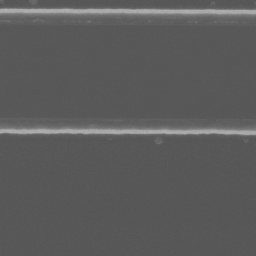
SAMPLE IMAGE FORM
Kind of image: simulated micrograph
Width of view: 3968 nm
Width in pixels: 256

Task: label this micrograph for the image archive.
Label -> one or a few lines or trenches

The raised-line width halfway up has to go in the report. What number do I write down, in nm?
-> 1870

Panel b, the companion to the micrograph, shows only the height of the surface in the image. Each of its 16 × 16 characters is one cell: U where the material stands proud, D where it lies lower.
DDDDDDDDDDDDDDDD
UUUUUUUUUUUUUUUU
UUUUUUUUUUUUUUUU
UUUUUUUUUUUUUUUU
UUUUUUUUUUUUUUUU
UUUUUUUUUUUUUUUU
UUUUUUUUUUUUUUUU
UUUUUUUUUUUUUUUU
DDDDDDDDDDDDDDDD
DDDDDDDDDDDDDDDD
DDDDDDDDDDDDDDDD
DDDDDDDDDDDDDDDD
DDDDDDDDDDDDDDDD
DDDDDDDDDDDDDDDD
DDDDDDDDDDDDDDDD
DDDDDDDDDDDDDDDD